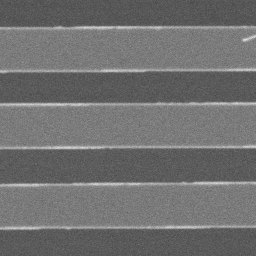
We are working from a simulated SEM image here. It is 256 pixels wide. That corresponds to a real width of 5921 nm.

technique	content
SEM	lines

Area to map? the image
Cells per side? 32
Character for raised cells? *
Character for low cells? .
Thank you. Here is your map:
................................
................................
................................
********************************
********************************
********************************
********************************
********************************
********************************
................................
................................
................................
................................
********************************
********************************
********************************
********************************
********************************
*************...................
................................
................................
................................
................................
********************************
********************************
********************************
********************************
********************************
*****...*.......................
................................
................................
................................